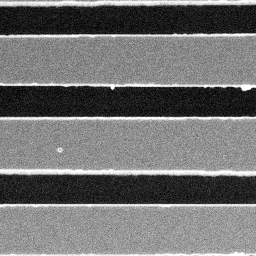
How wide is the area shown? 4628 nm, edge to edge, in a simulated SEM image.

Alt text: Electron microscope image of lines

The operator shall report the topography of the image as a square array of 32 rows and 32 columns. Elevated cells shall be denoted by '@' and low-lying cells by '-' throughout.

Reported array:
--------------------------------
--------------------------------
--------------------------------
--------------------------------
-----@@-@@@@@@@@@@@@@@@@@@@@@@@@
@@@@@@@@@@@@@@@@@@@@@@@@@@@@@@@@
@@@@@@@@@@@@@@@@@@@@@@@@@@@@@@@@
@@@@@@@@@@@@@@@@@@@@@@@@@@@@@@@@
@@@@@@@@@@@@@@@@@@@@@@@@@@@@@@@@
@@@@@@@@@@@@@@@@@@@@@@@@@@@@@@@@
@@@@@@@@@@@@@@@@@@@@@@@@@@@@@@@@
--------------------------------
--------------------------------
--------------------------------
--------------------------------
@@@@@@@@@@@@@@@@@@@@@@@@@@@@@@@@
@@@@@@@@@@@@@@@@@@@@@@@@@@@@@@@@
@@@@@@@@@@@@@@@@@@@@@@@@@@@@@@@@
@@@@@@@@@@@@@@@@@@@@@@@@@@@@@@@@
@@@@@@@@@@@@@@@@@@@@@@@@@@@@@@@@
@@@@@@@@@@@@@@@@@@@@@@@@@@@@@@@@
---------------------@@-@@@@@@@@
--------------------------------
--------------------------------
--------------------------------
--------------------------------
@@@@@@@@@@@@@@@@@@@@@@@@@@@@@@@@
@@@@@@@@@@@@@@@@@@@@@@@@@@@@@@@@
@@@@@@@@@@@@@@@@@@@@@@@@@@@@@@@@
@@@@@@@@@@@@@@@@@@@@@@@@@@@@@@@@
@@@@@@@@@@@@@@@@@@@@@@@@@@@@@@@@
@@@@@@@@@@@@@@@@@@@@@@@@@@@@@@@@